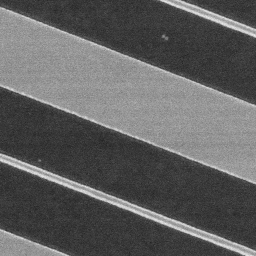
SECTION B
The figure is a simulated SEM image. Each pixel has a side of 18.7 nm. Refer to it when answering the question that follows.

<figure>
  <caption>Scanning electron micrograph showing lines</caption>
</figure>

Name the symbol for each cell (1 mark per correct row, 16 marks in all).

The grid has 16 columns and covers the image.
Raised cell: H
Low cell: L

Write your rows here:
LLLLLLLLLLLLLLLL
HHHLLLLLLLLLLLLL
HHHHHLLLLLLLLLLL
HHHHHHHHLLLLLLLL
HHHHHHHHHHHLLLLL
HHHHHHHHHHHHHLLL
LLLHHHHHHHHHHHHH
LLLLLLHHHHHHHHHH
LLLLLLLLHHHHHHHH
LLLLLLLLLLLHHHHH
LLLLLLLLLLLLLHHH
LLLLLLLLLLLLLLLL
LLLLLLLLLLLLLLLL
LLLLLLLLLLLLLLLL
LLLLLLLLLLLLLLLL
HHHLLLLLLLLLLLLL